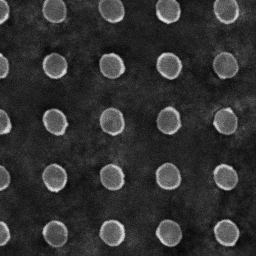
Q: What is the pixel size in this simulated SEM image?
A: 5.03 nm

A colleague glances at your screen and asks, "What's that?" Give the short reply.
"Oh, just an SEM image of a regular array of raised bodies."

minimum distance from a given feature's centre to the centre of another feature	280	nm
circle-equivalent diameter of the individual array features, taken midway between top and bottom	127	nanometres